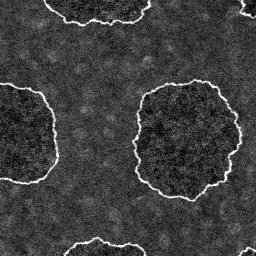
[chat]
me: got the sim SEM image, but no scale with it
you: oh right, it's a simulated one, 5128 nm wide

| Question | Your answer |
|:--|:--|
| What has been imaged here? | raised bodies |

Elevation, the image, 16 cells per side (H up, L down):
LLLHHHHHHLLLLLLH
LLLLLLLLLLLLLLLL
LLLLLLLLLLLLLLLL
LLLLLLLLLLLLLLLL
LLLLLLLLLLLLLLLL
HLLLLLLLLLHHHLLL
HHHLLLLLLHHHHHLL
HHHLLLLLLHHHHHHL
HHHLLLLLLHHHHHHL
HHHHLLLLLHHHHHHL
HHHLLLLLLHHHHHLL
LLLLLLLLLHHHHLLL
LLLLLLLLLLLLLLLL
LLLLLLLLLLLLLLLL
LLLLLLLLLLLLLLLL
LLLLHHHHHLLLLLLL